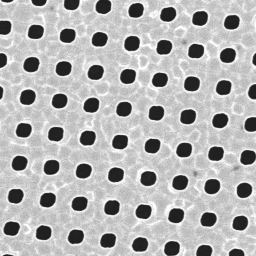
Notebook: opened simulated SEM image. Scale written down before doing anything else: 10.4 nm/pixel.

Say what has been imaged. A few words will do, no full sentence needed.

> a regular array of holes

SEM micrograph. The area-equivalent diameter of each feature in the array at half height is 0.164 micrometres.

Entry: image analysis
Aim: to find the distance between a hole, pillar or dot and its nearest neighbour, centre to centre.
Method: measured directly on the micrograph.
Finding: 333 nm